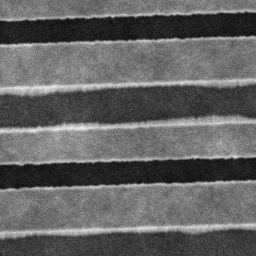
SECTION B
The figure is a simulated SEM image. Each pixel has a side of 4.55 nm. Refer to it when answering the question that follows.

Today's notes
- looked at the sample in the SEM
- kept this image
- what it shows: lines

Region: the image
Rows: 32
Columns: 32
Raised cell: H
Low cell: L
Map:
HHHHHHHHHHHHHHHHHHHHHHHHHHHHHHHH
HHHHHHHHHHHHHHHHHHHHHHHHHHHLHHLL
HHHHLLLLLLLLLLLLLLLLLLLLLLLLLLLL
LLLLLLLLLLLLLLLLLLLLLLLLLLLLLLLL
LLLLLLLLLLLLLLLLLLLLLLLLLLLLLLLL
LLLHHHHHHHHHHHHHHHHHHHHHHHHHHHHH
HHHHHHHHHHHHHHHHHHHHHHHHHHHHHHHH
HHHHHHHHHHHHHHHHHHHHHHHHHHHHHHHH
HHHHHHHHHHHHHHHHHHHHHHHHHHHHHHHH
HHHHHHHHHHHHHHHHHHHHHHHHHHHHHHHH
HHHHHHHHHHHHHHHHHHHHLLLLLLLLLLLL
LLLLLLLLLLLLLLLLLLLLLLLLLLLLLLLL
LLLLLLLLLLLLLLLLLLLLLLLLLLLLLLLL
LLLLLLLLLLLLLLLLLLLLLLLLLLLLLLLL
LLLLLLLLLLLLLLLLLLLLLLLLLLLLLLLL
LLLLLLLLLLLLLLLLLLLLLHHHHHHHHHHH
HHHHHHHHHHHHHHHHHHHHHHHHHHHHHHHH
HHHHHHHHHHHHHHHHHHHHHHHHHHHHHHHH
HHHHHHHHHHHHHHHHHHHHHHHHHHHHHHHH
HHHHHHHHHHHHHHHHHHHHHHHHHHHHHHHH
HHHLHLLLLLLLLLLLLLLLLLLLLLLLLLLL
LLLLLLLLLLLLLLLLLLLLLLLLLLLLLLLL
LLLLLLLLLLLLLLLLLLLLLLLLLLLLLLLL
LLLLHHHHHHHHHHHHHHHHHHHHHHHHHHHH
HHHHHHHHHHHHHHHHHHHHHHHHHHHHHHHH
HHHHHHHHHHHHHHHHHHHHHHHHHHHHHHHH
HHHHHHHHHHHHHHHHHHHHHHHHHHHHHHHH
HHHHHHHHHHHHHHHHHHHHHHHHHHHHHHHH
HHHHHHHHHHHHHHHHHHHHHHLHHLLLLLLL
LLLLLLLLLLLLLLLLLLLLLLLLLLLLLLLL
LLLLLLLLLLLLLLLLLLLLLLLLLLLLLLLL
LLLLLLLLLLLLLLLLLLLLLLLLLLLLLLLL